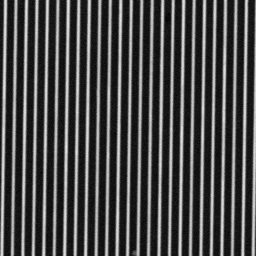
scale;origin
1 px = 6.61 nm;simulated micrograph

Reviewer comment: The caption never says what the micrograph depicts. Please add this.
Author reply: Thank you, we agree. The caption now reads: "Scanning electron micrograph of parallel lines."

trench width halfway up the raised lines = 0.0578 um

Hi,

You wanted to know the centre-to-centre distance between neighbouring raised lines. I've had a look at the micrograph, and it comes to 69.2 nm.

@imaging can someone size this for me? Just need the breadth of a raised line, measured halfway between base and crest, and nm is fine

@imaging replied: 13.2